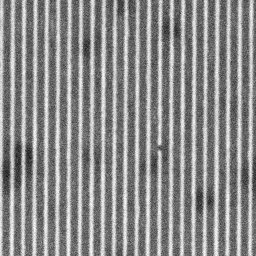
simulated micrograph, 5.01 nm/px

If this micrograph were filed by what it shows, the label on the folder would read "parallel lines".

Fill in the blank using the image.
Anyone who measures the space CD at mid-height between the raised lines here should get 0.0439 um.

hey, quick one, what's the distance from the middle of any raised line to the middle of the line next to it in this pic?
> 56.9 nm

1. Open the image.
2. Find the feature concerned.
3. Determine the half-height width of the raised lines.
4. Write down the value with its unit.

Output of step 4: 0.0132 micrometres